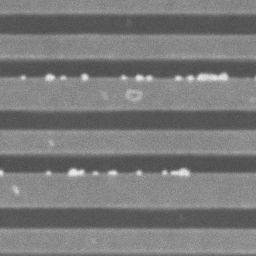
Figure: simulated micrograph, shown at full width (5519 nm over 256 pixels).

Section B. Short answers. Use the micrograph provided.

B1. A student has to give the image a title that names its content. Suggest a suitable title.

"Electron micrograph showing lines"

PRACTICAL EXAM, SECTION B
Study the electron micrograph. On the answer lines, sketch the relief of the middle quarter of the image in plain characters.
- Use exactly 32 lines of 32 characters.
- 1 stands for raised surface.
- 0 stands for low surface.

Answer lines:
00000000000000000000000000000000
00000000000000000000000000000000
00000000000000000000000000000000
10001100000000110011110000001111
11111111111111111111111111111111
11111111111111111111111111111111
11111111111111111111111111111111
11111111111111111111111111111111
11111111111111111111111111111111
11111111111111111111111111111111
11111111111111111111111111111111
00000000000000000000000000000000
00000000000000000000000000000000
00000000000000000000000000000000
00000000000000000000000000000000
00000000000000000000000000000000
00000000000000000000000000000000
11111111111111111111111111111111
11111111111111111111111111111111
11111111111111111111111111111111
11111111111111111111111111111111
11111111111111111111111111111111
00000000000000000000000000000000
00000000000000000000000000000000
00000000000000000000000000000000
00000000000000000000000000000000
00101000000000000000000000000110
11111111111111111111111111111111
11111111111111111111111111111111
11111111111111111111111111111111
11111111111111111111111111111111
11111111111111111111111111111111